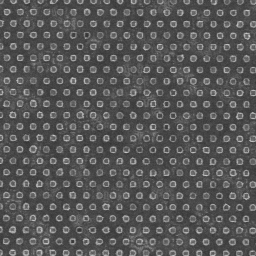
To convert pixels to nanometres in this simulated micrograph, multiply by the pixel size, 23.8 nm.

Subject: a regular array of raised bodies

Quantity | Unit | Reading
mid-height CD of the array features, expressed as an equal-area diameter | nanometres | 156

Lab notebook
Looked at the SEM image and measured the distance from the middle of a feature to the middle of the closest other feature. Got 307 nm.